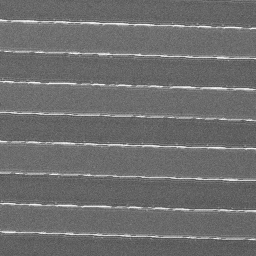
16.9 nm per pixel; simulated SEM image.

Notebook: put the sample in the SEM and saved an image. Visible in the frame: lines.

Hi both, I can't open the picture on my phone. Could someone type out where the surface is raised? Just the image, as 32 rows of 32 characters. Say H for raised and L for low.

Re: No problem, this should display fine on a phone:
LLLLLLLLLLLLLLLLLLLLLLLLLLLLLLLL
LLLLLLLLLLLLLLLLLLLLLLLLLLLLLLLL
LLLLLLLLLLLLLLLLLLLLLLLLLLLLLLLL
HHHHHHHHHHHHHHHHHHHHHHHHHHHHHHLL
HHHHHHHHHHHHHHHHHHHHHHHHHHHHHHHH
HHHHHHHHHHHHHHHHHHHHHHHHHHHHHHHH
LLLLHHHHHHHHHHHHHHHHHHHHHHHHHHHH
LLLLLLLLLLLLLLLLLLLLLLLLLLLLLLLL
LLLLLLLLLLLLLLLLLLLLLLLLLLLLLLLL
LLLLLLLLLLLLLLLLLLLLLLLLLLLLLLLL
HHHHHHHHHHLLLLLLLLLLLLLLLLLLLLLL
HHHHHHHHHHHHHHHHHHHHHHHHHHHHHHHH
HHHHHHHHHHHHHHHHHHHHHHHHHHHHHHHH
HHHHHHHHHHHHHHHHHHHHHHHHHHHHHHHH
LLLLLLLLLLLLLLLLLHHHHHHHHHHHHHHH
LLLLLLLLLLLLLLLLLLLLLLLLLLLLLLLL
LLLLLLLLLLLLLLLLLLLLLLLLLLLLLLLL
LLLLLLLLLLLLLLLLLLLLLLLLLLLLLLLL
HHHHHHHHHHHHHHHHHHHHHHHHHHHHLLLL
HHHHHHHHHHHHHHHHHHHHHHHHHHHHHHHH
HHHHHHHHHHHHHHHHHHHHHHHHHHHHHHHH
HHHHHHHHHHHHHHHHHHHHHHHHHHHHHHHH
LLLLLLLLLLLLLLLLLLLLLLLLLLLLLLLL
LLLLLLLLLLLLLLLLLLLLLLLLLLLLLLLL
LLLLLLLLLLLLLLLLLLLLLLLLLLLLLLLL
HHLLLLLLLLLLLLLLLLLLLLLLLLLLLLLL
HHHHHHHHHHHHHHHHHHHHHHHHHHHHHHHH
HHHHHHHHHHHHHHHHHHHHHHHHHHHHHHHH
HHHHHHHHHHHHHHHHHHHHHHHHHHHHHHHH
LLLLLLLLLLLLLLLLLLLHHHHHHHHHHHHH
LLLLLLLLLLLLLLLLLLLLLLLLLLLLLLLL
LLLLLLLLLLLLLLLLLLLLLLLLLLLLLLLL